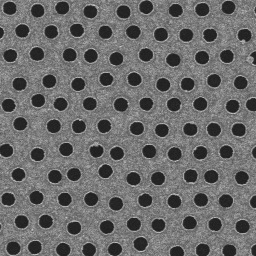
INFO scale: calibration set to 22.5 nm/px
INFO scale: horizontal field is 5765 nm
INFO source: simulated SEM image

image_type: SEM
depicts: a regular array of holes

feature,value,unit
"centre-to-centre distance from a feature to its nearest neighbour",555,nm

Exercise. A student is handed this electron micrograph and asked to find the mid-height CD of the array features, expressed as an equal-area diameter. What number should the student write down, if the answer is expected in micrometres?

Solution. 0.306